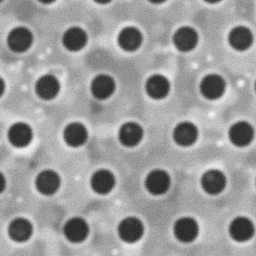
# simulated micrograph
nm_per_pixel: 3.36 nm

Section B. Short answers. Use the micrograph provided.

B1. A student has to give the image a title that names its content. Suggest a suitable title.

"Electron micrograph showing a regular array of holes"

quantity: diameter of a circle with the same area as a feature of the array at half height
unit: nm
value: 92.7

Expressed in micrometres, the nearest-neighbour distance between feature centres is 0.184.